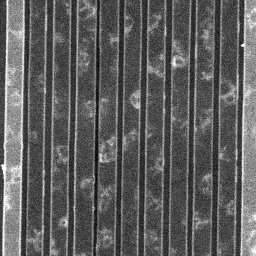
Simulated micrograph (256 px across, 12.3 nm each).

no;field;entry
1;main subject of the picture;parallel lines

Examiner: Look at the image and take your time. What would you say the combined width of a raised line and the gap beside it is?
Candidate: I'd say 293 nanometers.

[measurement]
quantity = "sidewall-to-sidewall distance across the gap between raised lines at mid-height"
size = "0.0737 micrometres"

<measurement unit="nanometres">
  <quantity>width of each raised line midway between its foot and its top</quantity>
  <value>221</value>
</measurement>